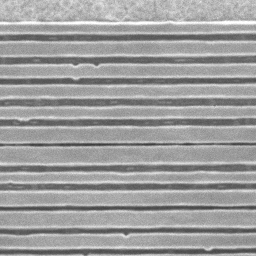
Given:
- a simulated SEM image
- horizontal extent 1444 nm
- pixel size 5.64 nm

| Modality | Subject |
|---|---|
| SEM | parallel lines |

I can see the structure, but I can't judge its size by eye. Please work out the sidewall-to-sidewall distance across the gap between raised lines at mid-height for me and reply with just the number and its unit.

38.8 nm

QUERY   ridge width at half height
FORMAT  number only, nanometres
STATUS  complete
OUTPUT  82.4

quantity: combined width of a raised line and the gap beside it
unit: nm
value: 120